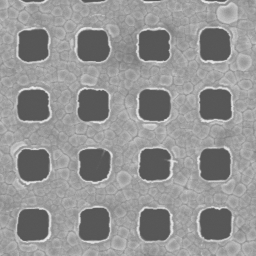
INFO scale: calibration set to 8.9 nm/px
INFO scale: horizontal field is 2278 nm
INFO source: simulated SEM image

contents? a regular array of holes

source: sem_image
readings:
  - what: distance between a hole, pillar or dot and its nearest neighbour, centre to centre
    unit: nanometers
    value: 530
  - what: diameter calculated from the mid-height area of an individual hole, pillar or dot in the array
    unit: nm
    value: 301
